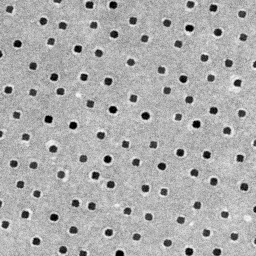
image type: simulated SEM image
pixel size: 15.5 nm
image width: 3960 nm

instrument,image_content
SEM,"a regular array of holes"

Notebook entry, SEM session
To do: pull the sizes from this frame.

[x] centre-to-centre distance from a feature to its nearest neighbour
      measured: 318 nanometers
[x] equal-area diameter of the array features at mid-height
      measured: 141 nm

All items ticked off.